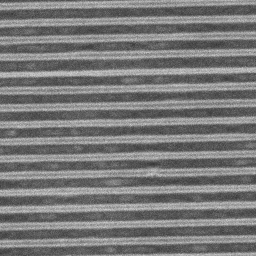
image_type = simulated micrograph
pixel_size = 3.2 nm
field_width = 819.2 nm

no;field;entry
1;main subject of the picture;parallel lines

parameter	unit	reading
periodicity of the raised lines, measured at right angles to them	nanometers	54.3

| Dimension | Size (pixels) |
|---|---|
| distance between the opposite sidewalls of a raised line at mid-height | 5.62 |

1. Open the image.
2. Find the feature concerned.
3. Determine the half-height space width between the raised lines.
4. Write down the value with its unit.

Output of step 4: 11.4 pixels